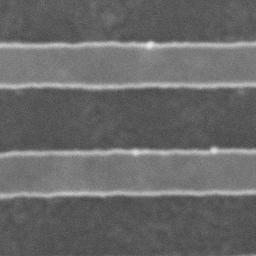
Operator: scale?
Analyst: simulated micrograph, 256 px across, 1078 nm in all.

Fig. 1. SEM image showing lines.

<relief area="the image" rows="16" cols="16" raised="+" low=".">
................
................
................
++++++++++++++++
++++++++++++++++
................
................
................
................
....++++++++++++
++++++++++++++++
++++++++++++++++
................
................
................
................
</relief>